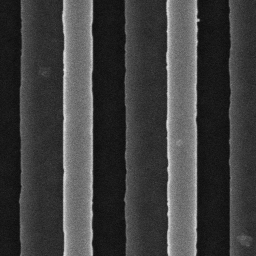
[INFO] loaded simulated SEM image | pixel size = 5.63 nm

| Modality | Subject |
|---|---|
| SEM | lines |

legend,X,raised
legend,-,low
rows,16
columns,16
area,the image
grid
-XXXXX--XXXX--XX
-XXXXX--XXXX--XX
-XXXXX--XXXX--XX
-XXXXX--XXXX--XX
-XXXXX--XXXX--XX
-XXXXX--XXXX--XX
-XXXXX--XXXX--XX
-XXXXX--XXXX--XX
-XXXXX--XXXX--XX
-XXXXX--XXXX--XX
-XXXXX--XXXX--XX
-XXXXX--XXXX--XX
-XXXXX--XXXX--XX
-XXXXX--XXXX--XX
-XXXXX--XXXX--XX
-XXXXX--XXXX--XX